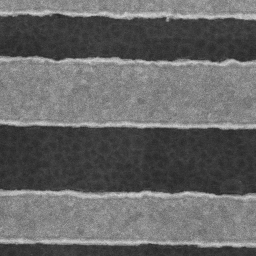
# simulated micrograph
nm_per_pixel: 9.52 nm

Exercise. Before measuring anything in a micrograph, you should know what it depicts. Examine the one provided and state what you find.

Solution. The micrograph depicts one or a few lines or trenches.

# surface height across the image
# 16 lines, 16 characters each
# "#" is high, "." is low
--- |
################
................
................
................
################
################
################
################
................
................
................
..............#.
################
################
################
................